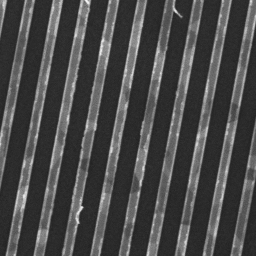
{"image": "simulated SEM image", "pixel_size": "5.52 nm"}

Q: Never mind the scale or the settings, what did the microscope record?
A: parallel lines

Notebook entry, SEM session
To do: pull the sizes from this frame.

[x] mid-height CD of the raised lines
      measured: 51.6 nanometres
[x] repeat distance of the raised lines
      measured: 0.153 micrometres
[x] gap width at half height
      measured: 105 nm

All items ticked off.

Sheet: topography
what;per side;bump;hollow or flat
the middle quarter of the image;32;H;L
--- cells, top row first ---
LHHHLLLLHHHLLLLLHHLLLLHHHLLLLHHH
LHHLLLLLHHLLLLLHHLLLLLHHHLLLLHHH
LHHLLLLLHHLLLLLHHLLLLLHHLLLLLHHL
LHHLLLLLHHLLLLLHHLLLLLHHLLLLLHHL
LHHLLLLLHHLLLLLHHLLLLLHHLLLLLHHL
HHHLLLLHHHLLLLLHHLLLLLHHLLLLLHHL
HHHLLLLHHLLLLLHHLLLLLHHHLLLLHHHL
HHLLLLLHHLLLLLHHLLLLLHHLLLLLHHLL
HHLLLLLHHLLLLLHHLLLLLHHLLLLLHHLL
HHLLLLLHHLLLLLHHLLLLLHHLLLLLHHLL
HHLLLLHHHLLLLLHHLLLLLHHLLLLLHHLL
HHLLLLHHHLLLLHHHLLLLHHHLLLLHHHLL
HLLLLLHHHLLLLHHLLLLLHHHLLLLHHHLL
HLLLLLHHLLLLLHHLLLLLHHLLLLLHHLLL
HLLLLLHHLLLLLHHLLLLLHHLLLLLHHLLL
HLLLLLHHLLLLLHHLLLLHHHLLLLLHHLLL
HLLLLHHHLLLLLHHLLLLHHHLLLLHHHLLL
HLLLLHHLLLLLHHLLLLLHHHLLLLHHHLLL
LLLLLHHLLLLLHHLLLLLHHLLLLLHHLLLL
LLLLLHHLLLLLHHLLLLLHHLLLLLHHLLLL
LLLLHHHLLLLLHHLLLLLHHLLLLLHHLLLL
LLLLHHHLLLLLHHLLLLLHHLLLLLHHLLLL
LLLLHHHLLLLHHHLLLLHHHLLLLHHHLLLL
LLLLHHLLLLLHHLLLLLHHHLLLLHHLLLLL
LLLLHHLLLLLHHLLLLLHHLLLLLHHLLLLL
LLLLHHLLLLLHHLLLLLHHLLLLLHHLLLLL
LLLLHHLLLLLHHLLLLLHHLLLLLHHLLLLL
LLLHHHLLLLLHHLLLLLHHLLLLHHHLLLLL
LLLHHHLLLLHHLLLLLHHHLLLLHHHLLLLH
LLLHHLLLLLHHLLLLLHHLLLLLHHLLLLLH
LLLHHLLLLLHHLLLLLHHLLLLLHHLLLLLH
LLLHHLLLLLHHLLLLLHHLLLLLHHLLLLLH